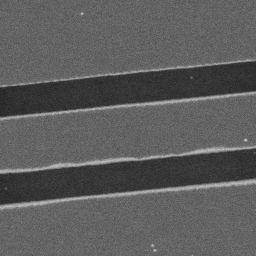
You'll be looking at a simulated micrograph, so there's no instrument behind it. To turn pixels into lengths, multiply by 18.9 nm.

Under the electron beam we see lines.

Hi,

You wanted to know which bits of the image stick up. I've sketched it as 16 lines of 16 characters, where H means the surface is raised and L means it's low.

HHHHHHHHHHHHHHHH
HHHHHHHHHHHHHHHH
HHHHHHHHHHHHHHHH
HHHHHHHHHHHHHHHH
HHHHHHHHHLLLLLLL
LLLLLLLLLLLLLLLL
LLLLLLLLHHHHHHHH
HHHHHHHHHHHHHHHH
HHHHHHHHHHHHHHHH
HHHHHHHHHHHHHLLL
HHHHLLLLLLLLLLLL
LLLLLLLLLLLLLHHH
LLLHHHHHHHHHHHHH
HHHHHHHHHHHHHHHH
HHHHHHHHHHHHHHHH
HHHHHHHHHHHHHHHH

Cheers